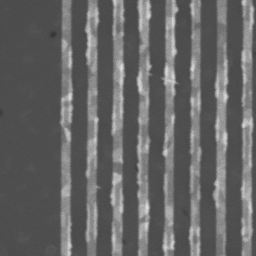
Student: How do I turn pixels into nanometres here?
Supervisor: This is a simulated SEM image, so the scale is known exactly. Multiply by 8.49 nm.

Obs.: parallel lines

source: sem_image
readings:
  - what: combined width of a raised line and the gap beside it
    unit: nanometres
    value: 220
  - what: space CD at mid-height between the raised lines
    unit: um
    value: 0.14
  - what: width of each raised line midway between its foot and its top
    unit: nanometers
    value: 77.5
